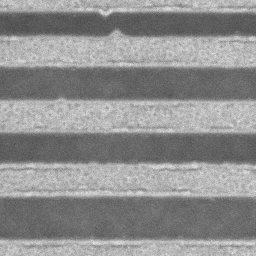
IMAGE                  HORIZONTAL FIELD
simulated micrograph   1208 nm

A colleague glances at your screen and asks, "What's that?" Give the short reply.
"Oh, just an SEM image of one or a few lines or trenches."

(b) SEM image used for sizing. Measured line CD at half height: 30.1 px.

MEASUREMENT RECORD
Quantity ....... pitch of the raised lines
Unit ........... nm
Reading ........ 304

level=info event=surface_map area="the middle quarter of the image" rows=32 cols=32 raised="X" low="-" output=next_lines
--------------XXX-X-------------
--------------------------------
--------------------------------
--------------------------------
--------------------------------
--------------------------------
--------------------------------
--------------------------------
--------------------------------
X-------------------------------
XXXXXXXXXXXXXXXXXXXXXXXXXXXXXXXX
XXXXXXXXXXXXXXXXXXXXXXXXXXXXXXXX
XXXXXXXXXXXXXXXXXXXXXXXXXXXXXXXX
XXXXXXXXXXXXXXXXXXXXXXXXXXXXXXXX
XXXXXXXXXXXXXXXXXXXXXXXXXXXXXXXX
XXXXXXXXXXXXXXXXXXXXXXXXXXXXXXXX
XXXXXXXXXXXXXXXXXXXXXXXXXXXXXXXX
--------------------------------
--------------------------------
--------------------------------
--------------------------------
--------------------------------
--------------------------------
--------------------------------
--------------------------------
XX-XXXXXXXXXXXXXXXXXXXXXXXXXXXXX
XXXXXXXXXXXXXXXXXXXXXXXXXXXXXXXX
XXXXXXXXXXXXXXXXXXXXXXXXXXXXXXXX
XXXXXXXXXXXXXXXXXXXXXXXXXXXXXXXX
XXXXXXXXXXXXXXXXXXXXXXXXXXXXXXXX
XXXXXXXXXXXXXXXXXXXXXXXXXXXXXXXX
XXXXXXXXXXXXXXXXXXXXXXXXXXXXXXXX